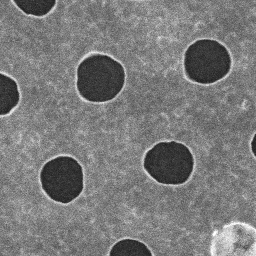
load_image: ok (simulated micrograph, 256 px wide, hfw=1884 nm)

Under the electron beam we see holes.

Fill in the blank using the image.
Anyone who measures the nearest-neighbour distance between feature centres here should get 794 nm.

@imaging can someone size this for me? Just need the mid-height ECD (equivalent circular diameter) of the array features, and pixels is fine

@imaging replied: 46.6